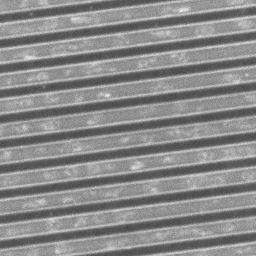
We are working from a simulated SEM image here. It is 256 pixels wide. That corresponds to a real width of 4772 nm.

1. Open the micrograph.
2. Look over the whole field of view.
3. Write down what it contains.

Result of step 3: parallel lines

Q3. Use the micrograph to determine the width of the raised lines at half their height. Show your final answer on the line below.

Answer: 222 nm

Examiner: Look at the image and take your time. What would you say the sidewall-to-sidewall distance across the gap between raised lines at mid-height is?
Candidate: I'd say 238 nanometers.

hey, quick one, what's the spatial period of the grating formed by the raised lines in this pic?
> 24.9 px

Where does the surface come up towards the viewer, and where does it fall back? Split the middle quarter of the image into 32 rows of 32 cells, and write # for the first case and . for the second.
..........................######
..................##############
...........#####################
...########################.....
###################.............
###########.....................
####..........................##
......................##########
..............##################
.......#####################....
#####################...........
#############...................
#####..........................#
........................########
................################
........######################..
.#####################..........
###############.................
#######.........................
.........................#######
..................##############
..........######################
..######################........
################................
#########.......................
#..........................#####
.....................###########
.............###################
......######################....
####################............
############....................
#####..........................#